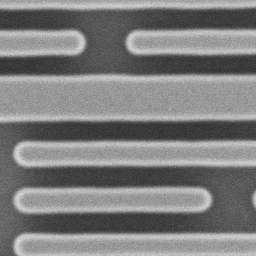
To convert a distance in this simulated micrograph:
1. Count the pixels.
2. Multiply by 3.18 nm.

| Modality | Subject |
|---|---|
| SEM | groups of lines, slits or small figures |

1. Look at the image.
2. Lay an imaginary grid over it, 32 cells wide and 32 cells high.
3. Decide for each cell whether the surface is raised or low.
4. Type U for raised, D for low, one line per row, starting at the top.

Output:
UUUUUUUUUUUUUUUUUUUUUUUUUUUUUUUU
DDDDDDDDDDDDDDDDDDDDDDDDDDDDDDDD
DDDDDDDDDDDDDDDDDDDDDDDDDDDDDDDD
DDDDDDDDDDDDDDDDDDDDDDDDDDDDDDDD
UUUUUUUUUUDDDDDDUUUUUUUUUUUUUUUU
UUUUUUUUUUDDDDDDUUUUUUUUUUUUUUUU
UUUUUUUUUUDDDDDDDUUUUUUUUUUUUUUU
DDDDDDDDDDDDDDDDDDDDDDDDDDDDDDDD
DDDDDDDDDDDDDDDDDDDDDDDDDDDDDDDD
DDDDDDDDDDDUUUUUDDDDUUUUUUUUUUUU
UUUUUUUUUUUUUUUUUUUUUUUUUUUUUUUU
UUUUUUUUUUUUUUUUUUUUUUUUUUUUUUUU
UUUUUUUUUUUUUUUUUUUUUUUUUUUUUUUU
UUUUUUUUUUUUUUUUUUUUUUUUUUUUUUUU
UUUUUUUUUUUUUUUUUUUUUUUUUUUUUUUU
DDDDDDDDDDDDDDDDDDDDDDDDDDDDDDDD
DDDDDDDDDDDDDDDDDDDDDDDDDDDDDDDD
DDDDDDDDDDDDDDDDDDDDDDDDDDDDDDDD
DDUUUUUUUUUUUUUUUUUUUUUUUUUUUUUU
DDUUUUUUUUUUUUUUUUUUUUUUUUUUUUUU
DDDUUUUUUUUUUUUUUUUUUUUUUUUUUUUU
DDDDDDDDDDDDDDDDDDDDDDDDDDDDDDDD
DDDDDDDDDDDDDDDDDDDDDDDDDDDDDDDD
DDDDDDDDDDDDDDDDDDDDDDDDDDDDDDDD
DDUUUUUUUUUUUUUUUUUUUUUUUUDDDDDD
DDUUUUUUUUUUUUUUUUUUUUUUUUDDDDDD
DDDUUUUDDDDDDDDDDDDDDDDDDDDDDDDD
DDDDDDDDDDDDDDDDDDDDDDDDDDDDDDDD
DDDDDDDDDDDDDDDDDDDDDDDDDDDDDDDD
DDDUUUUUUUUUUUUUUUUUUUUUUUUUUUUU
DDUUUUUUUUUUUUUUUUUUUUUUUUUUUUUU
DDUUUUUUUUUUUUUUUUUUUUUUUUUUUUUU